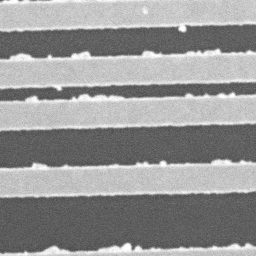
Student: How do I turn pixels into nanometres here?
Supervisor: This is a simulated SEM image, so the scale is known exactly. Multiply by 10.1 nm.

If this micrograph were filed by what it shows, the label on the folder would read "lines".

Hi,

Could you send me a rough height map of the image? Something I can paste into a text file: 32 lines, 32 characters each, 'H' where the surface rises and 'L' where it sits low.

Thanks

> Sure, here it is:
HHHHHHHHHHHHHHHHHHHHHHHHHHHHHHHH
HHHHHHHHHHHHHHHHHHHHHHHHHHHHHHHH
HHHHHHHHHHHHHHHHHHHHHHHHHHHHHHHH
HHHHHHHHHHLLLLLLLLLLLLLLLLLLLLLL
LLLLLLLLLLLLLLLLLLLLLLLLLLLLLLLL
LLLLLLLLLLLLLLLLLLLLLLLLLLLLLLLL
LLLLLLLLLLLLLLLLLLLLLLLLLLLLLLLL
LHHHHHHHHHHHHHHHHHHHHHHHHHHHHHHH
HHHHHHHHHHHHHHHHHHHHHHHHHHHHHHHH
HHHHHHHHHHHHHHHHHHHHHHHHHHHHHHHH
HHHHHHHHHHHHHHHHHHHHLLLLLLLLLLLL
LLLLLLLLLLLLLLLLLLLLLLLLLLLLLLLL
LLLLHLLLLLHHHHHHHHHHHHHHHHHHHHHH
HHHHHHHHHHHHHHHHHHHHHHHHHHHHHHHH
HHHHHHHHHHHHHHHHHHHHHHHHHHHHHHHH
HHHHHHHHHHHHHHHHHHHHHHHHHHHHHLLL
LLLLLLLLLLLLLLLLLLLLLLLLLLLLLLLL
LLLLLLLLLLLLLLLLLLLLLLLLLLLLLLLL
LLLLLLLLLLLLLLLLLLLLLLLLLLLLLLLL
LLLLLLLLLLLLLLLLLLLLLLLLLLLLLLLL
LLLLLLLLLLLLLLLLLLLLLLLLLLLHHHHH
HHHHHHHHHHHHHHHHHHHHHHHHHHHHHHHH
HHHHHHHHHHHHHHHHHHHHHHHHHHHHHHHH
HHHHHHHHHHHHHHHHHHHHHHHHHHHHHHHH
HHHLHHLLLLLLLLLLLLLLLLLLLLLLLLLL
LLLLLLLLLLLLLLLLLLLLLLLLLLLLLLLL
LLLLLLLLLLLLLLLLLLLLLLLLLLLLLLLL
LLLLLLLLLLLLLLLLLLLLLLLLLLLLLLLL
LLLLLLLLLLLLLLLLLLLLLLLLLLLLLLLL
LLLLLLLLLLLLLLLLLLLLLLLLLLLLLLLL
LLLLLLLLLLLLLLLLLLLLLLLLLLLLLLLL
LLLLLLHHLHHHHHHHHHHHHHHHHHHHHHHH